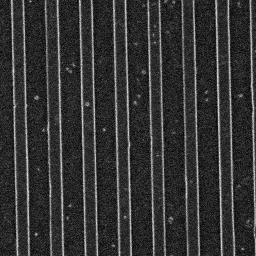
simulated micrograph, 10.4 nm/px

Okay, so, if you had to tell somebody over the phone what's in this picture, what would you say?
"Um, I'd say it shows parallel lines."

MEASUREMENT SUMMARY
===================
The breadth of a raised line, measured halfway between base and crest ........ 124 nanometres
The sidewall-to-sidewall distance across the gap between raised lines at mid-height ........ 21.7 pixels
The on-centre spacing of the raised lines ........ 355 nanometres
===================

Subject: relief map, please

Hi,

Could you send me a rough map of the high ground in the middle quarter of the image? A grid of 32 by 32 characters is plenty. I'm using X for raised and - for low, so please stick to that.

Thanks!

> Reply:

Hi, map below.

----XXX------XXX-----XXX------XX
----XXX------XXX------XX------XX
----XXX------XXX------XX------XX
-----XX------XXX------XX------XX
-----XX------XXX------XX------XX
-----XX------XXX------XX------XX
-----XX------XXX------XX------XX
-----XX------XXX------XX------XX
-----XX------XXX------XX------XX
-----XX------XXX------XX------XX
-----XX------XXX------XX------XX
-----XX------XXX------XX------XX
-----XX------XXX------XX------XX
-----XX------XXX------XXX-----XX
-----XX------XXX------XXX-----XX
-----XXX-----XXX------XXX-----XX
-----XXX-----XXX------XXX-----XX
-----XXX-----XXX------XXX-----XX
-----XXX-----XXX------XXX-----XX
-----XXX-----XXX------XXX-----XX
-----XXX-----XXX------XXX-----XX
-----XXX-----XXX------XXX-----XX
-----XXX-----XXX------XXX-----XX
-----XXX-----XXX------XXX-----XX
-----XXX-----XXX------XXX-----XX
-----XXX-----XXX------XXX-----XX
-----XXX-----XXX------XXX-----XX
-----XXX-----XXX------XXX-----XX
-----XXX-----XXX------XXX------X
-----XXX-----XXX------XXX------X
-----XXX------XX------XXX------X
-----XXX------XXX-----XXX------X